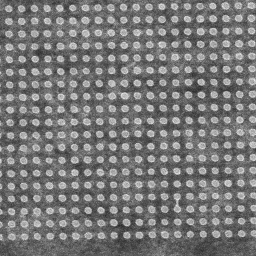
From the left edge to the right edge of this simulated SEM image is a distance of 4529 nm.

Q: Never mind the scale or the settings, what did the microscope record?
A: a regular array of raised bodies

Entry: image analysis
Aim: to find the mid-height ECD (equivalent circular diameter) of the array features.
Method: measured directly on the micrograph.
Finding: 111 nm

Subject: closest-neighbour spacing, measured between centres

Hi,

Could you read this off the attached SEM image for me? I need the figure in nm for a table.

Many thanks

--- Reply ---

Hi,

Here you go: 221